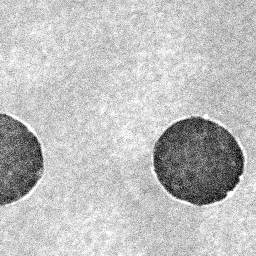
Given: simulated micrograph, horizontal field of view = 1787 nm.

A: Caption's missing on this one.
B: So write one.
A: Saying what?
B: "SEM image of holes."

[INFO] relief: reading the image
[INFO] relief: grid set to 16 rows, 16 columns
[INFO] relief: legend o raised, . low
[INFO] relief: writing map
oooooooooooooooo
oooooooooooooooo
oooooooooooooooo
oooooooooooooooo
oooooooooooooooo
oooooooooooooooo
oooooooooooooooo
.oooooooooo..ooo
..oooooooo.....o
...ooooooo.....o
...ooooooo.....o
..oooooooo.....o
.oooooooooo...oo
oooooooooooooooo
oooooooooooooooo
oooooooooooooooo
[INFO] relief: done